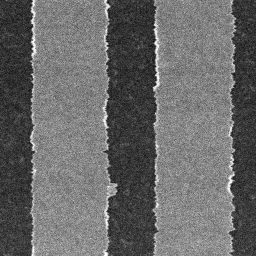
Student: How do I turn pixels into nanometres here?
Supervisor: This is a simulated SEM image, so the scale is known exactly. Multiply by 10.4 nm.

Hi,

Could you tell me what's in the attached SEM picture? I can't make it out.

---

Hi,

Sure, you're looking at one or a few lines or trenches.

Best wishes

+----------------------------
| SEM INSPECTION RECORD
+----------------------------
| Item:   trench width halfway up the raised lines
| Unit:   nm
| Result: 504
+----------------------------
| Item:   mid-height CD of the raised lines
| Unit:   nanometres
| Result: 787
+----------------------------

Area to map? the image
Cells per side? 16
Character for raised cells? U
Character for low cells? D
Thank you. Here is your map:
DDUUUUUDDDUUUUDD
DDUUUUUDDDUUUUUD
DDUUUUUDDDUUUUUD
DDUUUUUDDDUUUUUD
DDUUUUUDDDUUUUUD
DDUUUUUDDDUUUUUD
DDUUUUUDDDUUUUDD
DDUUUUUDDDUUUUUD
DDUUUUUDDDUUUUDD
DDUUUUUDDDUUUUUD
DDUUUUUDDDUUUUUD
DDUUUUUDDDUUUUDD
DDUUUUUDDDUUUUUD
DDUUUUUDDDUUUUDD
DDUUUUUDDDUUUUDD
DDUUUUUDDDUUUUDD